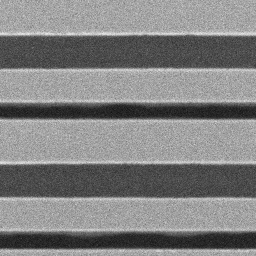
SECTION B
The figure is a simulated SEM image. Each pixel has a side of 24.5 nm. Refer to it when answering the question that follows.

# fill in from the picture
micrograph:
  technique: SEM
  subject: lines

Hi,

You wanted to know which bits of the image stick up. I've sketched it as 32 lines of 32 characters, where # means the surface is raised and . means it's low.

################################
################################
################################
################################
................................
................................
................................
................................
................................
################################
################################
################################
################################
................................
................................
################################
################################
################################
################################
################################
................................
................................
................................
................................
................................
################################
################################
################################
################################
................................
................................
################################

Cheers